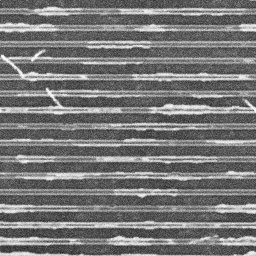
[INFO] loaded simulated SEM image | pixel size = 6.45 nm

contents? parallel lines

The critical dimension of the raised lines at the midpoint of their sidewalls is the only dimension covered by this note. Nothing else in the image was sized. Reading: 32.3 nm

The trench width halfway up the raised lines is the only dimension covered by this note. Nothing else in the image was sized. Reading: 71 nm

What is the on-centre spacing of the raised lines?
106 nm